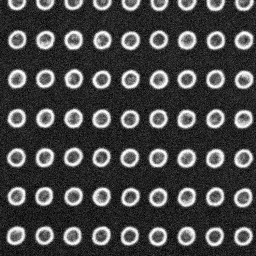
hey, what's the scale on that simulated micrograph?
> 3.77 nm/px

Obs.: a regular array of raised bodies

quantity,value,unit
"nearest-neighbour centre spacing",28.1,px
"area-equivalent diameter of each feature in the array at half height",61.9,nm